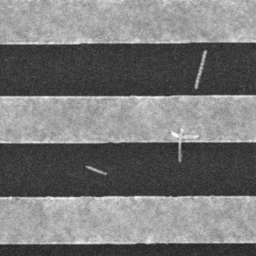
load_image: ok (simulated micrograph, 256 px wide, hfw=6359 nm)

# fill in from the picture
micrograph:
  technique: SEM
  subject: lines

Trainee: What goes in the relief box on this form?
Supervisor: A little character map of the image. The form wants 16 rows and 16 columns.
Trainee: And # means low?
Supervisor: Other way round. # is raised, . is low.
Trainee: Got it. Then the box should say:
################
################
################
................
................
................
################
################
################
................
................
................
################
################
################
................